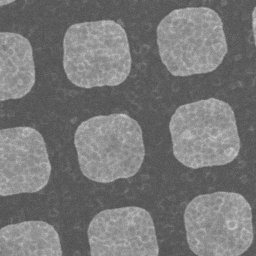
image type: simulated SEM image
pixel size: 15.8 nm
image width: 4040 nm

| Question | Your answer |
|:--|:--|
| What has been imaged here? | raised bodies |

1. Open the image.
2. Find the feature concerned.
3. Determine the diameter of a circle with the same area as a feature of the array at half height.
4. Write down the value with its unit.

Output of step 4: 1090 nm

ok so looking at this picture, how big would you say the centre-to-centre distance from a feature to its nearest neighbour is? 1480 nm